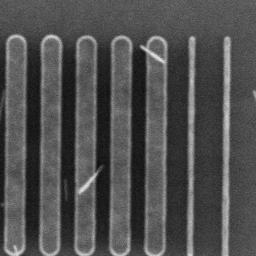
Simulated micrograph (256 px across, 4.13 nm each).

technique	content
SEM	groups of lines, slits or small figures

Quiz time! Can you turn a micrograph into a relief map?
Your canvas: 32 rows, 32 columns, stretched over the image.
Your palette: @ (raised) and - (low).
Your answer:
--------------------------------
--------------------------------
--------------------------------
--------------------------------
--------------------------------
-@@--@@@--@@--@@--@@@-------@---
-@@--@@@--@@--@@--@@@-----------
-@@--@@@--@@--@@--@@@-----------
-@@--@@@--@@--@@--@@@-------@---
-@@--@@@--@@--@@--@@@-------@---
-@@--@@@--@@--@@--@@@-------@---
-@@--@@@--@@--@@--@@@-------@---
-@@--@@---@@--@@--@@@-------@---
-@@--@@---@@--@@--@@@-------@---
-@@--@@---@@--@@--@@@-----------
-@@--@@---@@--@@--@@@-----------
-@@--@@---@@--@@--@@@-----------
-@@--@@---@@--@@--@@@-----------
-@@--@@---@@--@@--@@@-----------
-@@--@@---@@--@@--@@@-----------
-@@--@@---@@--@@--@@@-----------
-@@--@@---@@--@@--@@@-----------
-@@--@@---@@--@@--@@@-----------
-@@--@@---@@--@@--@@@-----------
-@@--@@---@@--@@--@@@-----------
-@@--@@---@@--@@--@@@-----------
-@@--@@--@@@--@@--@@@-----------
-@@--@@--@@@--@@--@@@-----------
-@@--@@--@@@--@@--@@@-----------
-@@--@@--@@@--@@--@@@-----------
-@@--@@--@@@--@@--@@@-----------
-@@--@@---@---@@--@@------------